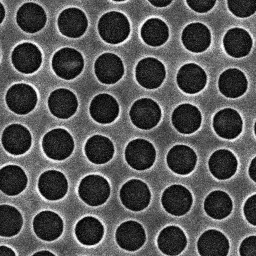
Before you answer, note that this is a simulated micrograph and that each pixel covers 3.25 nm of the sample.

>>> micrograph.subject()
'a regular array of holes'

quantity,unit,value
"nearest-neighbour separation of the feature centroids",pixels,41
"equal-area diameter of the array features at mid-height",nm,102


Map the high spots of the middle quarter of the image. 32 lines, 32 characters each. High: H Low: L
LLHLLHHLLLLLLLLHHHLLLLLLLHHHHLLL
LLLLLHHLLLLLLLLHHHLLLLLLLHHHHLLL
LLLLHHHHLLLLLLLHHHLLLLLLLLHHLLLL
LLLHHHHHLLLLLLLHHHLLLLLLLHHHLLLL
HHHHHHHHHLLLLHHHHHLLLLLLLHHHLLLL
HHHHHHHHHHHHHHHHHHHLLLLLHHHHLLLL
LLHHHHHHHHHHHHHHHHHHHHHHHHHHHLLL
LLLHHHHHHLLHHHHHHHHHHHHHHHHHHHHL
LLLHHHHLLLLLLHHHHHHLLHHHHHHHHHHH
LLLHHHHLLLLLLHHHHHLLLLLHHHHHHHHH
LLLLHHLLLLLLLLHHHLLLLLLLHHHHLLLL
LLLHHHLLLLLLLLHHLLLLLLLLHHHLLLLL
LLLHHHLLLLLLLLHHLLLLLLLLHHHLLLLL
LHHHHHHLLLLLLHHHLLLLLLLLHHHLLLLL
HHHHHHHHLLLLHHHHHLLLLLLLHHHLLLLL
HHHHHHHHHHHHHHHHHHLLLLLHHHHLLLLL
LHHHHHHHHHHHHHHHHHHLLHHHHHHHLLLL
LLHHHHHHLHHHHHHHHHHHHHHHHHHHHLLL
LLHHHHLLLLLHHHHHHHLHHHHHHHHHHHHH
LLLHHHLLLLLLHHHHLLLLLLHHHHHHHHHH
LLLHHLLLLLLLHHHHLLLLLLLHHHHLLLLH
LLHHHLLLLLLLLHHLLLLLLLLHHHLLLLLL
LLHHHLLLLLLLLHHLLLLLLLLHHHLLLLLL
LHHHHHLLLLLLHHHLLLLLLLLHHHLLLLLL
HHHHHHHLLLLHHHHHLLLLLLLHHHLLLLLL
HHHHHHHHHHHHHHHHHLLLLLHHHHLLLLLL
HHHHHHHHHHHHHHHHHHLLLHHHHHHLLLLL
HHHHHHHHHHHHHHHHHHHHHHHHHHHHLLLH
LHHHHLLLLLHHHHHHHLHHHHHHHHHHHHHH
LHHHLLLLLLLHHHHHLLLLHHHHHHHHHHHH
LHHHLLLLLLLLHHHLLLLLLHHHHHLLLLHH
LHHLLLLLLLLLHHLLLLLLLLHHHLLLLLLH